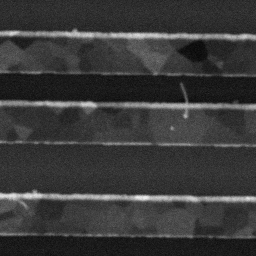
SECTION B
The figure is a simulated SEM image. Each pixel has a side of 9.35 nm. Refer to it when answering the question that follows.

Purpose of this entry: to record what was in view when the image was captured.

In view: lines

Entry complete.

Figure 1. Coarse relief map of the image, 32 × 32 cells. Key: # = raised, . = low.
................................
................................
................................
................................
#############################.##
################################
################################
################################
################################
................................
................................
................................
................................
################################
################################
################################
################################
################################
................................
................................
................................
................................
................................
................................
########.##.....................
################################
################################
################################
################################
................#.##############
................................
................................